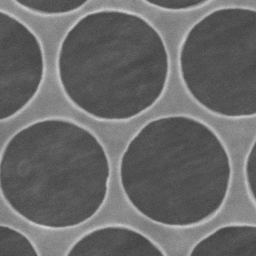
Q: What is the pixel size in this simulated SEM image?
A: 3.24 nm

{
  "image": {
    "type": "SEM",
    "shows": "holes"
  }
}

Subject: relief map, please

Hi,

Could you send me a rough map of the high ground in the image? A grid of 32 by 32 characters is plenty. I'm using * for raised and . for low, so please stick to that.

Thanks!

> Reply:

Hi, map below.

***.......*********......*******
****....****...************.....
..********........*******.......
...******..........*****........
....****............***.........
.....***............***.........
.....**..............**.........
.....**..............**.........
.....**..............**.........
.....***.............**.........
.....***.............**.........
....****............****........
....*****..........******.......
...*******........********......
.***********.....************.**
****.....*********.......*******
**.........*******........******
*...........*****..........*****
*............***............****
.............**.............***.
..............*..............**.
..............*..............**.
.............**..............**.
.............**.............***.
.............***............****
*............****...........****
**..........******.........*****
****.......********......*******
.************...************....
...********.......********......
....*****..........******.......
.....****...........****........